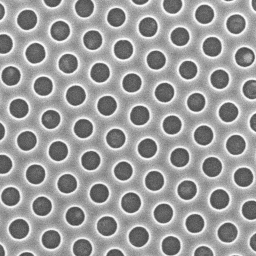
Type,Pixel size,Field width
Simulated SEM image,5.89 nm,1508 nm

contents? a regular array of holes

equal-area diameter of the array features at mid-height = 0.121 µm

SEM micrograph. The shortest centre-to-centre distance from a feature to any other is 194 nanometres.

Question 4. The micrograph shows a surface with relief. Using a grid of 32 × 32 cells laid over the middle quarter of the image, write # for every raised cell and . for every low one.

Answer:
....###....##########....####...
...####.....###########.#####...
######......####..###########...
#######....####....###########..
########..####......############
##..##########.....####....#####
#....##########....####.....####
......################......####
......###....##########....####.
#....###.....###########..#####.
##.#####.....#####..###########.
########.....####....##########.
#########...####......##########
################......###....###
###....##########....####.....##
##.....#################......##
##.....#####..###########....###
###....####....###########..####
####..####......####.###########
###########....####....#########
.##########....###.....#########
.#################.....####....#
.####....##########....####....#
####.....###########..####.....#
####.....#####..###########....#
#####....####....##########...##
######..####.....###############
..##########.....####...########
...##########...####.....#######
...#################.....####...
...####....#########.....###....
...###.....##########...####....